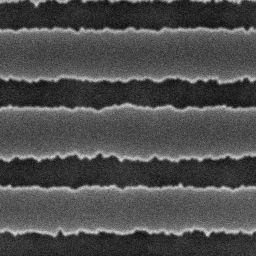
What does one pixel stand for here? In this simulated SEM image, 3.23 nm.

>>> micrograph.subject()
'lines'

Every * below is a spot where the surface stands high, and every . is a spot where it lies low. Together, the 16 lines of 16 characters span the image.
................
................
****************
****************
****************
................
................
****************
****************
****************
................
................
****************
****************
********.***.***
................